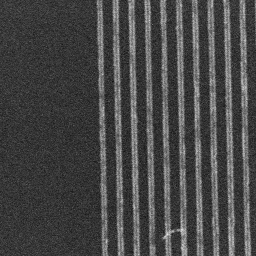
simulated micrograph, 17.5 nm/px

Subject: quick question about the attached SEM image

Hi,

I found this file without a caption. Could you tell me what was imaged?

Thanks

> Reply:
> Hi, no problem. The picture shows parallel lines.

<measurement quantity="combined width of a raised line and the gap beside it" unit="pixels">15.8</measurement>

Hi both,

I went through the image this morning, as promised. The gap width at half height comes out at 196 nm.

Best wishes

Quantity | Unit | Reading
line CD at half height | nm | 80.8